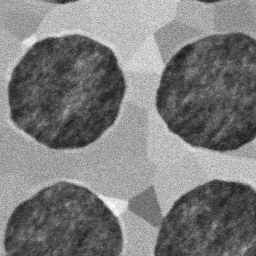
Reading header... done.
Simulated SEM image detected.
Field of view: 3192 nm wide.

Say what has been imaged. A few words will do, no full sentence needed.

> holes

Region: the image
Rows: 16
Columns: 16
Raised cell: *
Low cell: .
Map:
****************
****************
***...******....
*......****.....
*.......**......
*.......**......
*.......**......
*......***......
**....*****.....
****************
****************
***..********..*
**....*****.....
*......***......
........**......
........**......